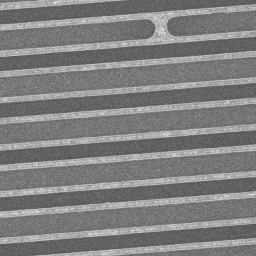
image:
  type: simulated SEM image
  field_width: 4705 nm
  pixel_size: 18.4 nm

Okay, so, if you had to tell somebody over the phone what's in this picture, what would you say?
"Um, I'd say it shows parallel lines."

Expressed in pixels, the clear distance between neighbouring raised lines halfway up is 15.3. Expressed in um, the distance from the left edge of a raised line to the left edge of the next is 0.43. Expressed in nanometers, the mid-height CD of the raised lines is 110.